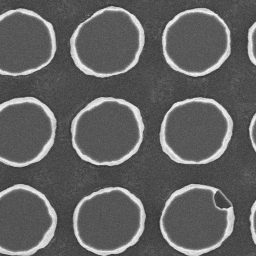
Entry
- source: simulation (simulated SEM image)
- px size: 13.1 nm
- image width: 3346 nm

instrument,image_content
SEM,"raised bodies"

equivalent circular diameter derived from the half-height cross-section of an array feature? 876 nm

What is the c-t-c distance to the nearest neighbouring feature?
1150 nm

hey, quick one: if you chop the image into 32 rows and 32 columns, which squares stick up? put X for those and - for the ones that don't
--------------------------------
-XXX--------XXXX-------XXX------
XXXXX------XXXXXX-----XXXXXX----
XXXXXX----XXXXXXXX---XXXXXXX----
XXXXXXX--XXXXXXXXX--XXXXXXXXX--X
XXXXXXX--XXXXXXXXX--XXXXXXXXX--X
XXXXXXX--XXXXXXXX----XXXXXXX---X
XXXXXX----XXXXXXX----XXXXXXX----
XXXXX-----XXXXXX------XXXXX-----
--------------------------------
--------------------------------
--------------------------------
--XX----------X---------XX------
XXXXXX-----XXXXXX----XXXXXXX----
XXXXXX----XXXXXXX----XXXXXXX----
XXXXXXX--XXXXXXXXX--XXXXXXXXX--X
XXXXXXX--XXXXXXXXX--XXXXXXXXX--X
XXXXXX---XXXXXXXXX--XXXXXXXX---X
XXXXXX---XXXXXXXX----XXXXXXX----
XXXXX-----XXXXXX------XXXXX-----
-XX---------X-------------------
--------------------------------
--------------------------------
-XXX-------------------XXX------
XXXXX-------XXXX------XXXXX-----
XXXXXX----XXXXXXX----XXXXXX-----
XXXXXXX---XXXXXXXX--XXXXXXXXX---
XXXXXXX---XXXXXXXX--XXXXXXXXX--X
XXXXXXX---XXXXXXXX--XXXXXXXXX---
XXXXXX----XXXXXXX---XXXXXXXX----
XXXXX-----XXXXXX-----XXXXXX-----
-XXX--------XXX--------XX-------